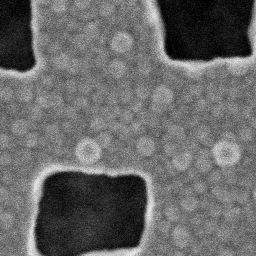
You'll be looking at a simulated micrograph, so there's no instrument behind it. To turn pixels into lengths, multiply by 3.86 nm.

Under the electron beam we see holes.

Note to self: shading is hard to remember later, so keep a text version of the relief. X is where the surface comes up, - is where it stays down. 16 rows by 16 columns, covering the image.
--XXXXXXXX------
--XXXXXXXX------
--XXXXXXXX------
--XXXXXXXXX----X
XXXXXXXXXXXXXXXX
XXXXXXXXXXXXXXXX
XXXXXXXXXXXXXXXX
XXXXXXXXXXXXXXXX
XXXXXXXXXXXXXXXX
XXXXXXXXXXXXXXXX
XXXXXXXXXXXXXXXX
XXX------XXXXXXX
XX-------XXXXXXX
XX-------XXXXXXX
XX-------XXXXXXX
XX------XXXXXXXX